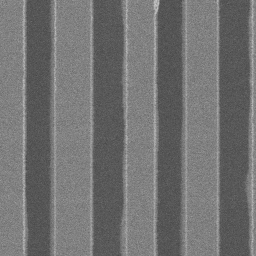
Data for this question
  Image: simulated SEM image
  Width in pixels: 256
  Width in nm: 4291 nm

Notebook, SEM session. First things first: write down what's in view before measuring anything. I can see lines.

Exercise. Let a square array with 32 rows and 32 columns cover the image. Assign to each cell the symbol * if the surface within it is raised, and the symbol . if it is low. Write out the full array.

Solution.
***....****.....****...****.....
***....****.....****...****.....
***....****.....****...****.....
***....****.....****...****.....
***....****.....****...****.....
***....****.....****...****.....
***....****.....****...****.....
***....****.....****...****.....
***....****.....***....****.....
***....****.....***....****.....
***....****.....***....****.....
***....****.....***....****.....
***....****.....***....****.....
***....****.....***....****.....
***....****.....****...****.....
***....****.....****...****.....
***....****.....****...****.....
***....****.....****...****.....
***....****.....****...****.....
***....****.....***....****.....
***....****.....***....****.....
***....****.....****...****.....
***....****.....***....****.....
***....****.....***....****....*
***....****.....***....****.....
***....****.....***....****.....
***....****.....***....****.....
***....****.....***....****.....
***....****.....***....****.....
***....****.....***....****.....
***....****.....***....****.....
***....****.....***....****.....